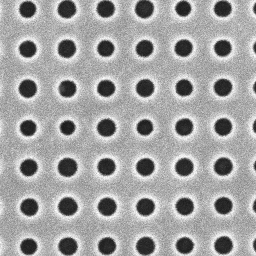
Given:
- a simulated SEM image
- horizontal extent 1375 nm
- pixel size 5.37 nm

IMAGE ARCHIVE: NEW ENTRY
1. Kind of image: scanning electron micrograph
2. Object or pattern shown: a regular array of holes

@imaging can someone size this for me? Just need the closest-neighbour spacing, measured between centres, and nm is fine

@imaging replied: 208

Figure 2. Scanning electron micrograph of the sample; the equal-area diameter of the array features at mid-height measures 98.4 nm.